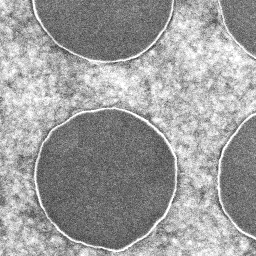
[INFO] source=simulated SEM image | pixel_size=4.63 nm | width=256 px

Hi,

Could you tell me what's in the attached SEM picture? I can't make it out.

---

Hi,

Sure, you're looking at raised bodies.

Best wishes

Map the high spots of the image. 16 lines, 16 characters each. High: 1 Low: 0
0011111111100011
0001111111000011
0001111111000001
0000011110000000
0000000000000000
0000000000000000
0000000000000000
0000111110000001
0001111111000001
0011111111100011
0011111111100011
0011111111100011
0011111111100011
0001111111000011
0000111110000001
0000001100000000